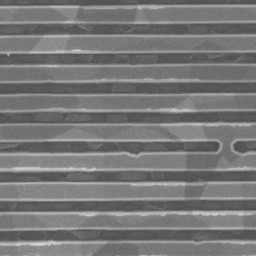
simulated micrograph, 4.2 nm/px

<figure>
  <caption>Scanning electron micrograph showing parallel lines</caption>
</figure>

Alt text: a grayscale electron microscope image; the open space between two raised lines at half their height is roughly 53.5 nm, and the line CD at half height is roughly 68.8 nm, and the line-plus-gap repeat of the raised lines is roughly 124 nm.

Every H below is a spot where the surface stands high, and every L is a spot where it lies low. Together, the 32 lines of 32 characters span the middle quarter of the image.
LLLLLLLLLLLLLLLLLLLLLHHHHHHHHHHH
HHHHHHHHHHHHHHHHHHHHHHHHHHHHHHHH
HHHHHHHHHHHHHHHHHHHHHHHHHHHHHHHH
HHHHHHHHHHHHHHHHHHHHHHHHHHHHHHHH
LLLLLLLLLLLLLLLLLLLLLLLLLLLLLLLL
LLLLLLLLLLLLLLLLLLLLLLLLLLLLLLLL
LLLLLLLLLLLLLLLLLLLLLLLLLLLLLLLL
LLLLLLLLLLLLLLLLLLLLLLLLLLLLLLLL
HHHHHHHHHHHHHHHHHHHHHHHHHHHHHHHH
HHHHHHHHHHHHHHHHHHHHHHHHHHHHHHHH
HHHHHHHHHHHHHHHHHHHHHHHHHHHHHHHH
HHHHHHHHHHHHHHHHHHHHHHHHHHHHHHHH
LLLLLLLLLLLLLLLLLLLLLLLLLLLLLLLL
LLLLLLLLLLLLLLLLLLLLLLLLLLLLLLLL
LLLLLLLLLLLLLLLLLLLLLLLLLLLLLLLL
HHHHHHHHHHHHHHHHHHHHHHHHHHHHHHHH
HHHHHHHHHHHHHHHHHHHHHHHHHHHHHHHH
HHHHHHHHHHHHHHHHHHHHHHHHHHHHHHHH
HHHHHHHHHHHHHHHHHHHHHHHHHHHHHHHH
LLLLLLLLLLLLLLLLLLLLLLLLLLLLLLLL
LLLLLLLLLLLLLLLLLLLLLLLLLLLLLLLL
LLLLLLLLLLLLLLLLLLLLLLLLLLLLLLLL
LLLLLLLLLLHHHHHHLLLHHHHHHHHHHHHH
HHHHHHHHHHHHHHHHHHHHHHHHHHHHHHHH
HHHHHHHHHHHHHHHHHHHHHHHHHHHHHHHH
HHHHHHHHHHHHHHHHHHHHHHHHHHHHHHHH
LLLHHHHHHLLLLLLLLLLLLLLLLLLLLLLL
LLLLLLLLLLLLLLLLLLLLLLLLLLLLLLLL
LLLLLLLLLLLLLLLLLLLLLLLLLLLLLLLL
LLLLLLLLLLLLLLLLLLLLLLLLLLLLLLLL
HHHHHHHHHHHHHHHHHHHHHHHHHHHHHHHH
HHHHHHHHHHHHHHHHHHHHHHHHHHHHHHHH